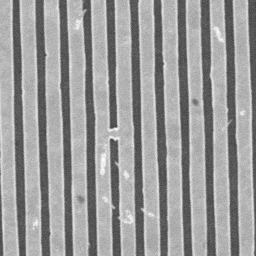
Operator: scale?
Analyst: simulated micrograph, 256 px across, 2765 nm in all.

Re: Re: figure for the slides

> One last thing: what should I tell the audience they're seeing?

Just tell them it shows parallel lines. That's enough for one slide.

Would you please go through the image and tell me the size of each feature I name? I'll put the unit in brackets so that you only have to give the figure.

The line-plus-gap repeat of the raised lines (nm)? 256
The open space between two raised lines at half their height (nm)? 94.5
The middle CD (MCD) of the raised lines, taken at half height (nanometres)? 159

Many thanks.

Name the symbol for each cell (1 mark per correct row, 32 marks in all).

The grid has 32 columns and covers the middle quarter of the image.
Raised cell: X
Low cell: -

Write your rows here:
-XXXX--XXXX--XXXX--XXX---XXX---X
-XXXX--XXXX--XXXX--XXX---XXX---X
-XXXX--XXXX--XXXX--XXX---XXX---X
-XXXX--XXXX--XXXX--XXX---XXXX--X
-XXXX--XXXX--XXXX--XXX---XXXX--X
--XXX--XXXX--XXXX--XXX---XXXX--X
--XXX--XXXX--XXXX--XXXX--XXXX--X
--XXX--XXXX--XXXX--XXXX--XXXX---
--XXX---XXX--XXXX---XXX--XXXX---
--XXX---XXX--XXXX---XXX--XXXX---
--XXX---XXX--XXXX---XXX--XXXX--X
--XXX---XXX--XXXX--XXXX--XXXX--X
--XXX---XXX---XXX--XXXX--XXXX---
--XXX---XXX---XXX--XXXX--XXXX--X
--XXX---XXX---XXX--XXXX--XXXX--X
--XXX---XXX---XXX--XXXX--XXXX--X
--XXX---XXXXXXXXX---XXX---XXX---
--XXX---XXXXXXXXX---XXX---XXX---
--XXX---XXXXXXXXX---XXX---XXX---
--XXX---XXX---XXX---XXX---XXX---
--XXX---XXX---XXX---XXX---XXX---
--XXX---XXX---XXX---XXX---XXX---
--XXX---XXX---XXX---XXX---XXX---
--XXX---XXX---XXX---XXX---XXX---
--XXX---XXX---XXXX--XXX---XXX---
--XXXX--XXX--XXXX---XXX---XXX---
--XXXX--XXX---XXX---XXX---XXX---
--XXXX--XXX---XXX---XXX---XXX---
--XXX---XXX---XXX---XXX---XXX---
--XXX---XXXX--XXX---XXXX--XXX---
--XXX---XXXX--XXX---XXXX--XXX---
--XXX---XXXX--XXX---XXX---XXX---